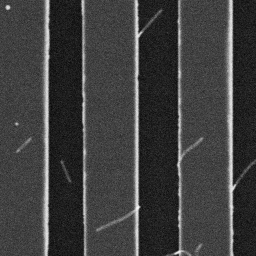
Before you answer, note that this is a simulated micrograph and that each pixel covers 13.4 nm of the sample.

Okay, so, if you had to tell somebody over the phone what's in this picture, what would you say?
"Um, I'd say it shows lines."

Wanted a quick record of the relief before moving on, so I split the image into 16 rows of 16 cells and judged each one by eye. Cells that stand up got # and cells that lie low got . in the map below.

###..####..###..
###..####..###..
###..####..###..
###..####..###..
###..####..###..
###..####..###..
###..####..###..
###..####..###..
###..####..###..
###..####..###..
###..####..###..
###..####..####.
###..####..###..
###..####..###..
###..####..###..
###..####..###..